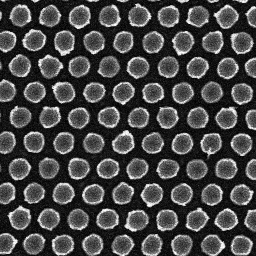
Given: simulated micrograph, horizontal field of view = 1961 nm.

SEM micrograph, a regular array of raised bodies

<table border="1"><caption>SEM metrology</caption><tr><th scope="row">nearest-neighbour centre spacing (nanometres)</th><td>221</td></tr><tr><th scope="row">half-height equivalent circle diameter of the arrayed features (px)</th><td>21.3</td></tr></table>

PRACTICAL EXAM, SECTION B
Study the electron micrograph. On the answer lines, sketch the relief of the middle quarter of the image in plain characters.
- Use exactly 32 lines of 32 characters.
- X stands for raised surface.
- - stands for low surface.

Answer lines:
-XXXXX---XXXXX--XXXXX---XXXX---X
-XXXXX---XXXXX--XXXXX---XXXX---X
--XXX----XXXX---XXXXX---XXXX---X
--------------------------------
--------------------------------
XX----XXXX---XXXX---XXXX----XXXX
XX---XXXXX--XXXXXX--XXXXX--XXXXX
XXX--XXXXX--XXXXXX--XXXXX--XXXXX
XX---XXXXX--XXXXX---XXXXX--XXXXX
X-----XX------XX-----XX-----XXX-
--------------------------------
--XXX-----XXX----XXX----XXXX----
-XXXXX---XXXXX---XXXX---XXXX---X
-XXXXX---XXXXX--XXXXX--XXXXXX--X
-XXXXX---XXXXX--XXXXX---XXXX---X
--XXX-----XXX----XXX----XXX-----
--------------------------------
XX----XX------XXX-----XX-----XX-
XX---XXXXX---XXXX---XXXX----XXXX
XX---XXXXX--XXXXX---XXXXX--XXXXX
XX---XXXXX--XXXXXX--XXXXX--XXXXX
XX----XXX----XXXX---XXXX---XXXXX
--------------------------------
--------------------------------
-XXXXX---XXXX----XXX----XXXX---X
-XXXXX--XXXXX---XXXXX--XXXXXX--X
-XXXXX--XXXXXX--XXXXX--XXXXXX--X
-XXXXX---XXXX---XXXX----XXXX---X
--XXX-----X-----XXX-----XX------
--------------------------------
XX----XXX----XXX----XXXX----XXX-
XXX--XXXXX---XXXX---XXXXX--XXXXX